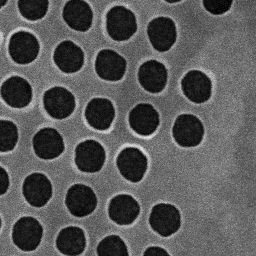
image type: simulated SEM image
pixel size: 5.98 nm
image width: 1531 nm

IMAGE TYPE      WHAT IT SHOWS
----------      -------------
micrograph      a regular array of holes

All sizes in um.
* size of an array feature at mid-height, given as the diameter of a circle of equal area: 0.196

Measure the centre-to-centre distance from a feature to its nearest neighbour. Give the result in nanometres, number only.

257